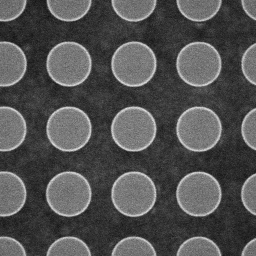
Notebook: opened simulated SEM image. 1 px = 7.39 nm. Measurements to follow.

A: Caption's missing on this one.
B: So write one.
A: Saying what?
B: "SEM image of an array of small figures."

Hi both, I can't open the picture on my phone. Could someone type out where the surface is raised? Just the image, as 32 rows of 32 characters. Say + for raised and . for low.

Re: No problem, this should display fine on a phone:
+++...+++++...+++++...++++++..++
+++...+++++....++++....++++....+
+.......+.......++......++......
................................
................................
++.....+++......++......++......
+++...+++++...+++++....++++....+
+++...+++++...+++++...++++++..++
+++...+++++...+++++...++++++..++
+++...+++++...+++++....++++....+
++.....+++.....+++......++......
................................
................................
+.......+.......++......++......
+++...+++++....++++....++++....+
+++...+++++...+++++...++++++..++
+++...+++++...+++++...++++++..++
+++...+++++...+++++...+++++....+
++.....+++.....+++.....+++......
................................
................................
................................
+++...+++++....++++....++++....+
+++...+++++...+++++...++++++..++
+++...+++++...+++++...++++++..++
+++...+++++...+++++...+++++...++
++.....+++.....+++.....+++.....+
................................
................................
................................
++.....++++....++++....++++....+
+++...+++++...+++++...++++++..++